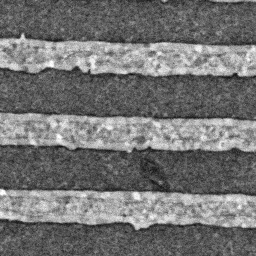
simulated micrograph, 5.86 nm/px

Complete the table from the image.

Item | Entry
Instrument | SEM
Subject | one or a few lines or trenches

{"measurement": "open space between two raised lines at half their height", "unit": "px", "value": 50.2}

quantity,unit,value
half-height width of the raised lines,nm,145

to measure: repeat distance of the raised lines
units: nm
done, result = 440